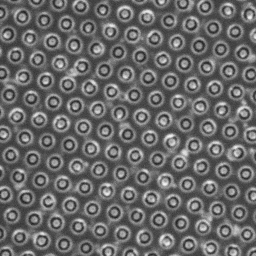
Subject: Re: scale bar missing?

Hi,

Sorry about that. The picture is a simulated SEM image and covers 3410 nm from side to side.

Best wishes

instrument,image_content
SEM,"a regular array of ring-shaped grooves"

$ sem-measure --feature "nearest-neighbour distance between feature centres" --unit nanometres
294